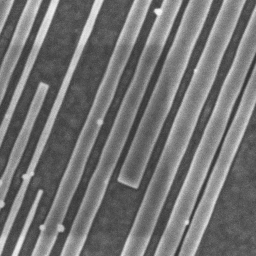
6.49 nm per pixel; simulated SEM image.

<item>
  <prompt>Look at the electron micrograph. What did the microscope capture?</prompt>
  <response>groups of lines, slits or small figures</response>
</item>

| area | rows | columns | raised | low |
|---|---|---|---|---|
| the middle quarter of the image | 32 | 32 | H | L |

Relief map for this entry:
LLHLLLLLLLLHHHHLLLHHHHHLLHHHHHHL
LHLLLLLLLLLHHHHLLLHHHHLLHHHHHHLL
LHLLLLLLLLHHHHLLLLHHHHLLHHHHHHLL
HHLLLLLLLLHHHHLLLLHHHLLLHHHHHLLL
HLLLLLLLLLHHHHLLLHHHHLLLHHHHHLLL
HLLLLLLLLHHHHLLLHHHHHLLHHHHHHLLH
HLLLLLLLLHHHHLLLHHHHLLLHHHHHLLLH
LLLLLLLLHHHHLLLLHHHHLLHHHHHHLLHH
LLLLLLLLHHHHLLLHHHHHLLHHHHHHLLHH
LLLLLLLLHHHHLLLHHHHLLHHHHHHLLLHH
LLLLLLLHHHHLLLHHHHHLLHHHHHHLLHHH
LLLLLLLHHHHLLLHHHHLLHHHHHHLLLHHH
LLLLLLHHHHLLLLHHHHLLHHHHHHLLHHHH
LLLLLLHHHHLLLHHHHHLLHHHHHLLLHHHH
LLLLLLHHHHLLLHHHHLLHHHHHHLLLHHHH
LLLLLHHHHLLLHHHHHLLHHHHHLLLHHHHH
LLLLLHHHHLLLHHHHLLHHHHHHLLLHHHHH
LLLLHHHHLLLLHHHHLLHHHHHHLLHHHHHH
LLLLHHHHLLLHHHHHLLHHHHHLLLHHHHHH
LLLHHHHHLLLHHHHLLHHHHHHLLLHHHHHL
LLLHHHHLLLHHHHHLLHHHHHLLLHHHHHHL
LLLHHHHLLLHHHHLLHHHHHHLLLHHHHHLL
LLHHHHLLLLHHHHLLHHHHHHLLHHHHHHLL
LLHHHHLLLHHHHHLLHHHHHLLLHHHHHHLL
LLHHHHLLLHHHHLLHHHHHHLLLHHHHHLLL
LHHHHLLLHHHHHLLHHHHHLLLHHHHHHLLL
LHHHHLLLHHHHLLHHHHHHLLLHHHHHLLLH
HHHHLLLLHHHHLLHHHHHHLLHHHHHHLLLH
HHHHLLLHHHHLLLHHHHHLLLHHHHHHLLLH
HHHHLLHHHHHLLLHHHHHLLLHHHHHLLLHH
HHHLLLHHHHHLLLLLHHHLLHHHHHHLLLHH
HHHLLLHHHHLLLLLLLLLLLHHHHHLLLHHH